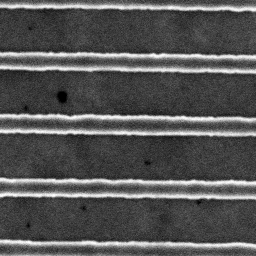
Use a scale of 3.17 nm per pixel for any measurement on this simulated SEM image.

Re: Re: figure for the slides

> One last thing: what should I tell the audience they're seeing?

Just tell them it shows lines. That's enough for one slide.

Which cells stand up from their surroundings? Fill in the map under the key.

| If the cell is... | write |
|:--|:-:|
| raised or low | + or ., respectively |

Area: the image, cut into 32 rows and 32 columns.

++++++++++++++++++++++++++++++++
................................
................................
................................
................................
................................
................................
++++++++++++++++++++++++++++++++
.+++++++++++++++++++++++++++++++
................................
................................
................................
................................
................................
++++++++..++++...+..............
++++++++++++++++++++++++++++++++
+..+++++++++++++++++++++++++++++
................................
................................
................................
................................
................................
+++++++.++.++...................
++++++++++++++++++++++++++++++++
....+++.++++++++++++++++++++++++
................................
................................
................................
................................
................................
++++++++++++++++++++++++.....++.
++++++++++++++++++++++++++++++++